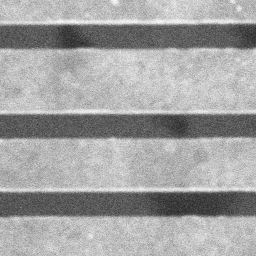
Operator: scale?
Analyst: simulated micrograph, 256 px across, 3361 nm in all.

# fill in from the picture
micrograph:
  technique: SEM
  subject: lines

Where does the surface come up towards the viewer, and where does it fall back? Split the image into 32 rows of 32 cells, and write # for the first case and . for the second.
################################
################################
################################
................................
................................
................................
################################
################################
################################
################################
################################
################################
################################
################################
................................
................................
................................
################################
################################
################################
################################
################################
################################
################################
................................
................................
................................
################################
################################
################################
################################
################################